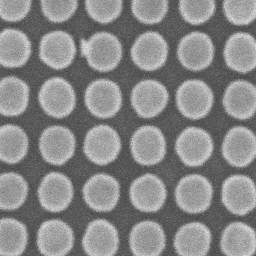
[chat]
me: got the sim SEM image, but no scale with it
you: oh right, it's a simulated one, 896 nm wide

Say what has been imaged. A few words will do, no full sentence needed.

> a regular array of raised bodies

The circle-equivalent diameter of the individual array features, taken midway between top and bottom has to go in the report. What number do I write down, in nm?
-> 128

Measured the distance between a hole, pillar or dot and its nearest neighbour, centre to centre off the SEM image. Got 0.161 um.